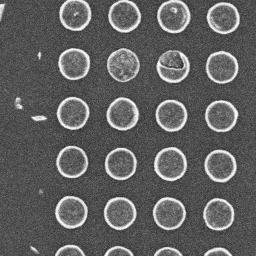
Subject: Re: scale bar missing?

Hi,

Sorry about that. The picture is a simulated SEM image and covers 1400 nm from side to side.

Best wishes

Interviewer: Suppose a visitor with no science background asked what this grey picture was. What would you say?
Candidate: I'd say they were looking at a regular array of raised bodies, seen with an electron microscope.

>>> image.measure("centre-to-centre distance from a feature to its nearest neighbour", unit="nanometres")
266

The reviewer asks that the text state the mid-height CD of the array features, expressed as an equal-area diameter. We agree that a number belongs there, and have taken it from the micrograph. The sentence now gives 166 nanometers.